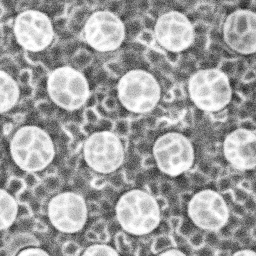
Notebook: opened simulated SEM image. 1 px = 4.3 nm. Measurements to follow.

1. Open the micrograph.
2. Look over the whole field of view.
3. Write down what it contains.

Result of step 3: a regular array of raised bodies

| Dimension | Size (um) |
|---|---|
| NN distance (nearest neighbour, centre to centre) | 0.296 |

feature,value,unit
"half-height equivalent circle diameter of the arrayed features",0.172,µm